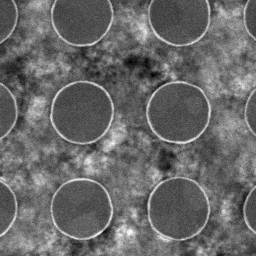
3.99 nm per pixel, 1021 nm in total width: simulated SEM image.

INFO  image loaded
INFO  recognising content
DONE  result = raised bodies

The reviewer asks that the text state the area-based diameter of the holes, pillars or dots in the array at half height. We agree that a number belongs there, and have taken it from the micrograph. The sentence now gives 0.249 microns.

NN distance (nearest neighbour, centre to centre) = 385 nanometers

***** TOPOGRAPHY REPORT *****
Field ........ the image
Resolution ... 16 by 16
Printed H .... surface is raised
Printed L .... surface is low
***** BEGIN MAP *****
HLLHHHHLLHHHHLLH
HLLHHHHLLHHHHLLH
LLLLHHLLLLHHLLLL
LLLLLLLLLLLLLLLL
LLLLLLLLLLLLLLLL
LLLLHHLLLLHHLLLL
HLLHHHHLLHHHHLLH
HLLHHHHLLHHHHLLH
LLLLHHLLLLHHLLLL
LLLLLLLLLLLLLLLL
LLLLLLLLLLLLLLLL
LLLLHHLLLLHHLLLL
HLLHHHHLLHHHHLLH
HLLHHHHLLHHHHLLH
LLLLHHLLLLHHLLLL
LLLLLLLLLLLLLLLL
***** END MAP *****